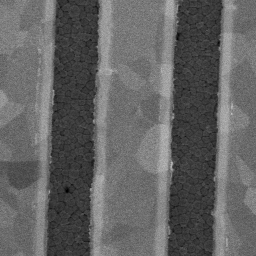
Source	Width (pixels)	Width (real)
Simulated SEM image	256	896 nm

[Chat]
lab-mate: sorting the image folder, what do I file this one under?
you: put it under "one or a few lines or trenches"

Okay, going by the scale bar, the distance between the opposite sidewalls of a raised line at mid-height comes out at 63.4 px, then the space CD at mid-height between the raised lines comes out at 57.4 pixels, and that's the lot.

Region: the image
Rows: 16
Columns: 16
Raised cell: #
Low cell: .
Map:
###....####...##
###....####...##
###....####...##
###....####...##
###....###....##
###...####....##
###...####....##
###...####....##
###...####....##
###...####....##
###...####....##
###...####....##
###...####....##
###...####....##
###...####....##
###...####....##